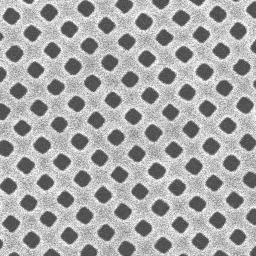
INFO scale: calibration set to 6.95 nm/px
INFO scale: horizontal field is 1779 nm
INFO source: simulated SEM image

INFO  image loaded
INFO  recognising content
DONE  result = a regular array of holes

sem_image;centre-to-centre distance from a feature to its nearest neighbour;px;26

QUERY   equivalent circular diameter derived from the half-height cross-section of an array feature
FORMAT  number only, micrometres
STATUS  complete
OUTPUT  0.113